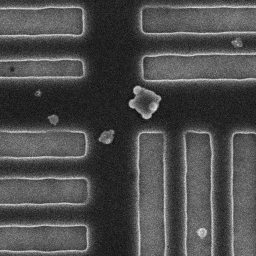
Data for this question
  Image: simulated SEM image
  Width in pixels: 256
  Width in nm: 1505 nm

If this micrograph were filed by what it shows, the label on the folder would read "groups of lines, slits or small figures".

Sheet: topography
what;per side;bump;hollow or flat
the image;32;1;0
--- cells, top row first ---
11111111111111111111111111111111
00000000001111111100000000000000
00000000001111111100000000000000
00000000001111111100000000000000
11111111111111111111111111111111
11111111111111111111111111111111
11111111111111111111111111111111
11111111011111111100000000000000
00000000001111111100000000000000
00000000001111111100000000000000
11111111111111111111111111111111
11111111111111111111111111111111
11111111111111111111111111111111
11111111111111111111111111111111
11111111111111111111111111111111
11111111111111111111111111111111
00000000001111111111111111111111
00000000000111111000011000111000
00000000000111111000011000111000
00000000001111111000111000111000
11111111111111111000011000111000
11111111111111111000011000111000
00000000000111111000011000111000
00000000000111111000011000111000
00000000000111111000011000111000
00110111111111111000011000111000
11111111111111111000011000111000
11111111111111111000011000111000
00000000000111111000011000011000
00000000000111111000011000011000
00000000000111111000011000011000
11111111111111111000011000111000